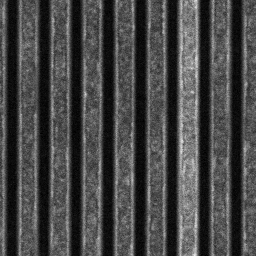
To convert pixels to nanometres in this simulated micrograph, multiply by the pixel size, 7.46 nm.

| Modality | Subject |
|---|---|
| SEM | parallel lines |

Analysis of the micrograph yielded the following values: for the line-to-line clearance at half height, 0.0952 µm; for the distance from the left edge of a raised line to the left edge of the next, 239 nm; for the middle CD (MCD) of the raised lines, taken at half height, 146 nm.